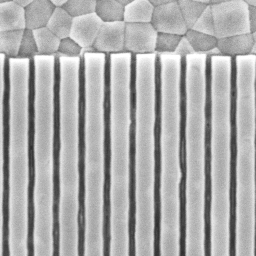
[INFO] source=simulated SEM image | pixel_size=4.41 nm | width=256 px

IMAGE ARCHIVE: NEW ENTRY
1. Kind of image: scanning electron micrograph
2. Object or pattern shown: parallel lines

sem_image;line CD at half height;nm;79.5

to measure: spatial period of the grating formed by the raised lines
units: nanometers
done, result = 111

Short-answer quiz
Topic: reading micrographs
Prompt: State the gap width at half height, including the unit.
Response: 7.12 pixels